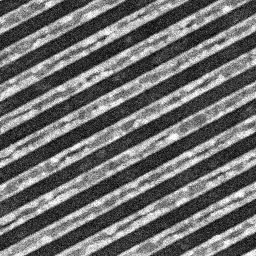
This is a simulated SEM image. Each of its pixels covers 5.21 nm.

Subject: parallel lines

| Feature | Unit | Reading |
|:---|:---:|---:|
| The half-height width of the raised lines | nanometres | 66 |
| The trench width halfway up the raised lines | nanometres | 89.5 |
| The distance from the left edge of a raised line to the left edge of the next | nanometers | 154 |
